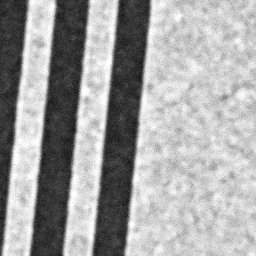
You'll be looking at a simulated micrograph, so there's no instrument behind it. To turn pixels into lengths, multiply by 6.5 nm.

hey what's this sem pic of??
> one or a few lines or trenches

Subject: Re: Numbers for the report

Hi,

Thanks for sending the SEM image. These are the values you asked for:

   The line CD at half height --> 22.4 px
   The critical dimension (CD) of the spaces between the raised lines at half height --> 38.8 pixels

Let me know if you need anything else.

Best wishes